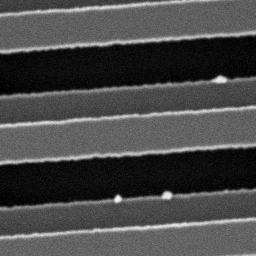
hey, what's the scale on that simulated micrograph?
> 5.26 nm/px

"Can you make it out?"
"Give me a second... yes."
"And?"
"lines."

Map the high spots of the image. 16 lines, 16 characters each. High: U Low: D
UUUUUUUUUUUUUUUU
UUUUUUUUUUUUUUUU
UUUUUUUUUUUDDDDD
DDDDDDDDDDDDDDDD
DDDDDDDDDDDDDDDD
DDDDDDDUUUUUUUUU
UUUUUUUUUUUUUUUU
UUUUUUUUUUUUUUUU
UUUUUUUUUUUUUUUU
UUUUUUUUUUUDDDDD
DDDDDDDDDDDDDDDD
DDDDDDDDDDDDDDDD
DDDDDDDUUUUUUUUU
UUUUUUUUUUUUUUUU
UUUUUUUUUUUUUUUU
UUUUUUUUUUUUUUUU